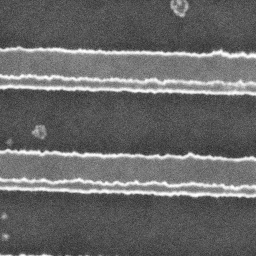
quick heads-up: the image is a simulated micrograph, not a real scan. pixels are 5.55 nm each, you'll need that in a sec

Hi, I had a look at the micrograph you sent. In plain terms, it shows lines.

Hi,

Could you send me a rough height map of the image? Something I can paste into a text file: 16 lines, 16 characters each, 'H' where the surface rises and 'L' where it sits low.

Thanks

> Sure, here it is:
LLLLLLLLLLLLLLLL
LLLLLLLLLLLLLLLL
LLLLLLLLLLLLLLLL
HHHHHHHHHHHHHHHH
HHHHHHHHHHHHHHHH
LLHHHHHHHHHHHHHH
LLLLLLLLLLLLLLLL
LLLLLLLLLLLLLLLL
LLLLLLLLLLLLLLLL
HLLLLLLLLLLLLLLL
HHHHHHHHHHHHHHHH
HHHHHHHHHHHHHHHH
LLLLLLLLLLLLLLLL
LLLLLLLLLLLLLLLL
LLLLLLLLLLLLLLLL
LLLLLLLLLLLLLLLL